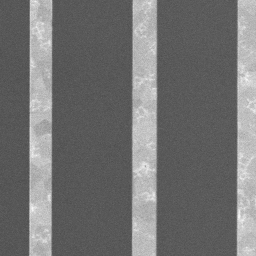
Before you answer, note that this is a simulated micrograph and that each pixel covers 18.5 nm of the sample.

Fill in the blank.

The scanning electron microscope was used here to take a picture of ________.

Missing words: one or a few lines or trenches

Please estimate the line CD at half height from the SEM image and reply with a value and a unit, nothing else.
0.4 µm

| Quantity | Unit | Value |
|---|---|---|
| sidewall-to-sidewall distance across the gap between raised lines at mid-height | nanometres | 1500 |